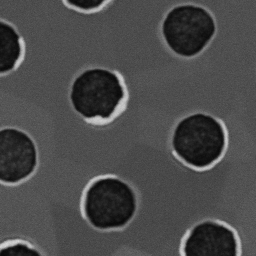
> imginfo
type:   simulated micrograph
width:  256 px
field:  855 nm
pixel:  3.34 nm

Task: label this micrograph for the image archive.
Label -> holes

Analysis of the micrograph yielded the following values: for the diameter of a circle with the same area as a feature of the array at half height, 167 nm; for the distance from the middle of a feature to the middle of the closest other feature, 368 nanometers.